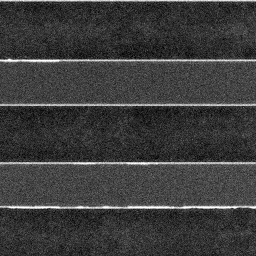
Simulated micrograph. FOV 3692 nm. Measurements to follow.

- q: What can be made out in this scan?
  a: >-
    lines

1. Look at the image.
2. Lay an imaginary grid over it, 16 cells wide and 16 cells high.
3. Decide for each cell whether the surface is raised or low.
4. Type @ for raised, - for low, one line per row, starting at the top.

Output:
----------------
----------------
----------------
----------------
@@@@@@@@@@@@@@@@
@@@@@@@@@@@@@@@@
@@@@@@@@@@@@@@@@
----------------
----------------
----------------
@@@@@@@@@@@@@@@@
@@@@@@@@@@@@@@@@
@@@@@@@@@@@@@@@@
----------------
----------------
----------------